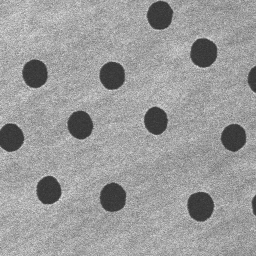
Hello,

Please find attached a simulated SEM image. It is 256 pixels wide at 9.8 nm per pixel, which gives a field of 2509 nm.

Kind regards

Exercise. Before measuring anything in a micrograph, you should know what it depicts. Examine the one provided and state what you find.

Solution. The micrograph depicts a regular array of holes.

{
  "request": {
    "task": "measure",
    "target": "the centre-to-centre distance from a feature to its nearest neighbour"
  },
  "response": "632 nanometers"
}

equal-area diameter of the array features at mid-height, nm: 269